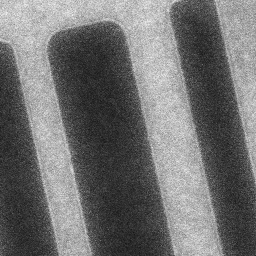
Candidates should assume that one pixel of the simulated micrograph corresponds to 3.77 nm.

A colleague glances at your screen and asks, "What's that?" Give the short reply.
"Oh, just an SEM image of one or a few lines or trenches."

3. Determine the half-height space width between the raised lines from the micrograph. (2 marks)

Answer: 44.2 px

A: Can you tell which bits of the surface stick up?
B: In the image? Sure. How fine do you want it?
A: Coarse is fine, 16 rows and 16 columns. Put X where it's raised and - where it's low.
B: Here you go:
-----------XXX--
-----XX----XXX--
---XXXXX---XXX--
X--XXXXX---XXX--
X--XXXXX---XXX--
X--XXXXXX---XXX-
XX--XXXXX---XXX-
XX--XXXXX---XXX-
XX--XXXXX---XXX-
XX--XXXXXX--XXXX
XXX-XXXXXX---XXX
XXX--XXXXX---XXX
XXX--XXXXX---XXX
XXX--XXXXX---XXX
XXX--XXXXXX---XX
XXXX--XXXXX---XX